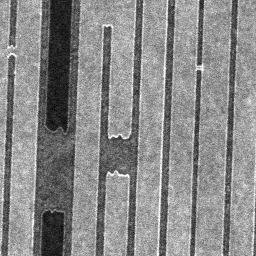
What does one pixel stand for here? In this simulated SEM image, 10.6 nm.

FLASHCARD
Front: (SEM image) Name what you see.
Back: parallel lines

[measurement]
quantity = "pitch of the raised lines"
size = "31.4 px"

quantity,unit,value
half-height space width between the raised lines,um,0.0782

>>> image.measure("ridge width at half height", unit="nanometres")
244